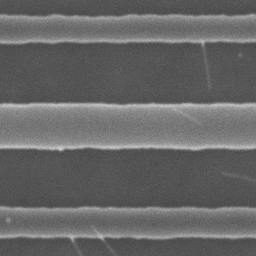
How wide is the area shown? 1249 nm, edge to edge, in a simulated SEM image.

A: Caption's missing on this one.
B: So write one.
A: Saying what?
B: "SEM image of lines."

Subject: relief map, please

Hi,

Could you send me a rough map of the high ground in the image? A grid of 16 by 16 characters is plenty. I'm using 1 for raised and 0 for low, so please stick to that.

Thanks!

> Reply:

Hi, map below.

0000000000000000
1111111111111111
1111111111111111
0000000000000000
0000000000000000
0000000000000000
1011111001011111
1111111111111111
1111111111111111
0000000000000000
0000000000000000
0000000000000000
0000000000000000
1111111111111111
1111111111111111
0000000000000000